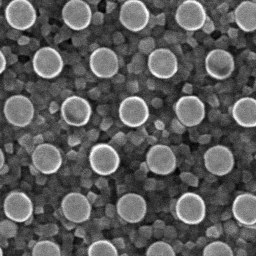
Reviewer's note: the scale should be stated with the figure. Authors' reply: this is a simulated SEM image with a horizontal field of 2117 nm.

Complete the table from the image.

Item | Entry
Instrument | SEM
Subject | a regular array of raised bodies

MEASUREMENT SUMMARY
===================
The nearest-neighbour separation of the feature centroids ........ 55.5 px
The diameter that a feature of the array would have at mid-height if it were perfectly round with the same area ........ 0.241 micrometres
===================